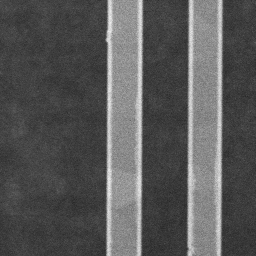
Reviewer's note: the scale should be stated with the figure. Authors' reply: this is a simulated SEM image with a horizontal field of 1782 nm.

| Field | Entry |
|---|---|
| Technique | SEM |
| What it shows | one or a few lines or trenches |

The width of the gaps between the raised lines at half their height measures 344 nm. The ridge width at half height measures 214 nanometers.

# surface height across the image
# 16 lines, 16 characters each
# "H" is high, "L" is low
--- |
LLLLLLLHHLLLHHLL
LLLLLLLHHLLLHHLL
LLLLLLLHHLLLHHLL
LLLLLLLHHLLLHHLL
LLLLLLLHHLLLHHLL
LLLLLLLHHLLLHHLL
LLLLLLLHHLLLHHLL
LLLLLLLHHLLLHHLL
LLLLLLLHHLLLHHLL
LLLLLLLHHLLLHHLL
LLLLLLLHHLLLHHLL
LLLLLLLHHLLLHHLL
LLLLLLLHHLLLHHLL
LLLLLLLHHLLLHHLL
LLLLLLLHHLLLHHLL
LLLLLLLHHLLLHHLL